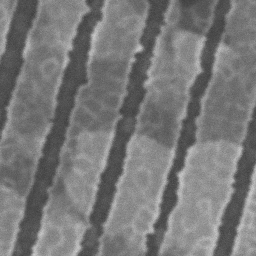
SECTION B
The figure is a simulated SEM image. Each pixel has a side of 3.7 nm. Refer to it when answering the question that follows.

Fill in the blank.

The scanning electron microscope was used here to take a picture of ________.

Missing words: one or a few lines or trenches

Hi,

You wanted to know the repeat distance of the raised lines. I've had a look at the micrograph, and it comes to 230 nm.